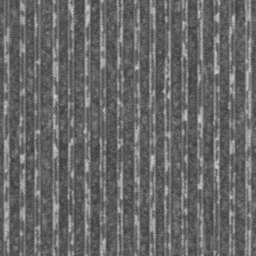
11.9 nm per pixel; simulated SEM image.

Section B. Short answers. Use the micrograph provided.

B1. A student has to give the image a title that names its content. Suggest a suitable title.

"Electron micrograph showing parallel lines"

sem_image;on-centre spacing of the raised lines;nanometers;192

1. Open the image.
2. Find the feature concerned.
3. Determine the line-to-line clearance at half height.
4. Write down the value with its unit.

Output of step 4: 133 nanometres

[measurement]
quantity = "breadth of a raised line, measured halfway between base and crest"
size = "61.1 nanometers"